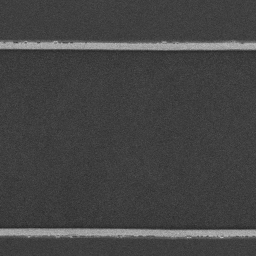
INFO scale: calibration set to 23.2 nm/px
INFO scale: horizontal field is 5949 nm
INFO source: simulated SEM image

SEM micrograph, one or a few lines or trenches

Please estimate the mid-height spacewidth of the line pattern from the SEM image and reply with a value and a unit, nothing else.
4350 nanometres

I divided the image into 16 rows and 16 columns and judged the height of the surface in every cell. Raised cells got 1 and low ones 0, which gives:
1111111111111111
1111111111111111
1111111111111111
0000000000000000
0000000000000000
0000000000000000
0000000000000000
0000000000000000
0000000000000000
0000000000000000
0000000000000000
0000000000000000
0000000000000000
0000000000000000
0000000000000000
1111111111111111